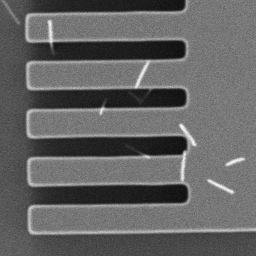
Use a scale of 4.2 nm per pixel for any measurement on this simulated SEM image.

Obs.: groups of lines, slits or small figures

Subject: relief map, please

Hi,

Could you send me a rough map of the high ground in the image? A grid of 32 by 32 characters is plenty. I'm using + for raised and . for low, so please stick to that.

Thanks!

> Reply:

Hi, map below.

.......................+++++++++
.................+++.+++++++++++
...+++++++++++++++++++++++++++++
...+++++++++++++++++++++++++++++
...+++++++++++++++++++++++++++++
.......................+++++++++
.......................+++++++++
...................+++++++++++++
...+++++++++++++++++++++++++++++
...+++++++++++++++++++++++++++++
...+++++++++++++++++++++++++++++
.......................+++++++++
.......................+++++++++
............+...++++++++++++++++
...+++++++++++++++++++++++++++++
...+++++++++++++++++++++++++++++
...+++++++++++++++++++++++++++++
.......................+++++++++
.......................+++++++++
.................++.++++++++++++
...+++++++++++++++++++++++++++++
...+++++++++++++++++++++++++++++
...+++++++++++++++++++++++++++++
.......................+++++++++
.......................+++++++++
..................++++++++++++++
....++++++++++++++++++++++++++++
....++++++++++++++++++++++++++++
....++++++++++++++++++++++++++++
................................
................................
................................